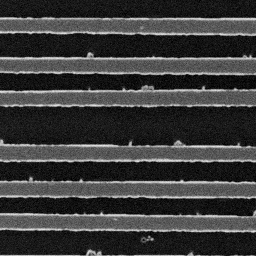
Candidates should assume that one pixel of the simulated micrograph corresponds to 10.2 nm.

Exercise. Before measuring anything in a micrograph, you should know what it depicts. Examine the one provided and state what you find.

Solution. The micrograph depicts lines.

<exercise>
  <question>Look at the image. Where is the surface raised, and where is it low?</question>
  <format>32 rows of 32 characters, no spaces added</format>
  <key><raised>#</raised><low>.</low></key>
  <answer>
................................
................................
################################
################################
................................
................................
................................
################################
################################
................................
................................
...#############################
################################
................................
................................
................................
................................
................................
################################
################################
................................
................................
................................
################################
################################
................................
................................
################################
################################
................................
................................
................................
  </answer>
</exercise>